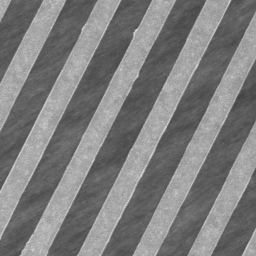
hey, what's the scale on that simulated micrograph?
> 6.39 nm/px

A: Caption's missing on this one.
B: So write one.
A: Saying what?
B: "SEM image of parallel lines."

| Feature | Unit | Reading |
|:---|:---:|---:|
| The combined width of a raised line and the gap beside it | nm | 313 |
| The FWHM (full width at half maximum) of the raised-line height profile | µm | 0.13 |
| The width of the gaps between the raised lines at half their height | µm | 0.183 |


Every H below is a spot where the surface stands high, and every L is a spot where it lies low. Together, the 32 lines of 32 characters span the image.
HLLLLHHHLLLLHHHLLLLHHHLLLLHHHLLL
HLLLLHHLLLLLHHLLLLHHHLLLLHHHLLLL
LLLLHHHLLLLHHHLLLLHHHLLLLHHHLLLH
LLLLHHLLLLHHHLLLLHHHLLLLHHHLLLLH
LLLHHHLLLLHHHLLLLHHHLLLLHHLLLLHH
LLLHHLLLLLHHLLLLHHHLLLLHHHLLLLHH
LLHHHLLLLHHHLLLLHHHLLLLHHLLLLHHH
LLHHLLLLLHHLLLLHHHLLLLHHHLLLLHHH
LHHHLLLLHHHLLLLHHHLLLLHHLLLLHHHL
LHHLLLLHHHLLLLHHHLLLLHHHLLLLHHHL
HHHLLLLHHHLLLLHHHLLLLHHLLLLLHHLL
HHLLLLHHHLLLLHHHLLLLHHHLLLLHHHLL
HHLLLLHHHLLLLHHHLLLLHHLLLLHHHLLL
HLLLLHHHLLLLHHHLLLLHHHLLLLHHHLLL
HLLLLHHHLLLLHHHLLLLHHLLLLHHHLLLL
LLLLHHHLLLLHHHLLLLHHHLLLLHHHLLLL
LLLLHHHLLLLHHHLLLLHHLLLLHHHLLLLH
LLLHHHLLLLHHHLLLLHHHLLLLHHHLLLLH
LLLHHHLLLLHHLLLLLHHLLLLHHHLLLLHH
LLHHHLLLLHHHLLLLHHHLLLLHHHLLLLHH
LLHHHLLLLHHLLLLLHHLLLLHHHLLLLHHH
LHHHLLLLHHHLLLLHHHLLLLHHHLLLLHHH
LHHHLLLLHHLLLLLHHLLLLHHHLLLLHHHL
HHHLLLLHHHLLLLHHHLLLLHHHLLLLHHHL
HHHLLLLHHLLLLLHHLLLLHHHLLLLHHHLL
HHLLLLHHHLLLLHHHLLLLHHHLLLLHHHLL
HHLLLLHHLLLLLHHLLLLHHHLLLLHHHLLL
HLLLLHHHLLLLHHHLLLLHHHLLLLHHHLLL
HLLLLHHLLLLHHHLLLLHHHLLLLHHHLLLL
LLLLHHHLLLLHHHLLLLHHHLLLLHHHLLLL
LLLHHHLLLLHHHLLLLHHHLLLLHHHLLLLH
LLLHHHLLLLHHHLLLLHHHLLLLHHHLLLLH